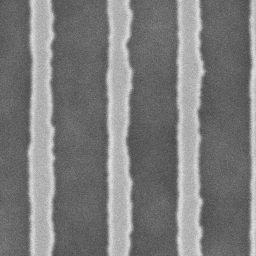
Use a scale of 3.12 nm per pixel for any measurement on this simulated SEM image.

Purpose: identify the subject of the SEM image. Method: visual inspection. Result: lines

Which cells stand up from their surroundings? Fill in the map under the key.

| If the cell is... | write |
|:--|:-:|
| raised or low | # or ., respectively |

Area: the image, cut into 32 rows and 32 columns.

....##........##......###......#
....##........##......###......#
....###.......##......###......#
....##........##......###......#
....###.......##......###......#
....##........##......###......#
....##........##......###......#
....##........##......###.......
....##........##......###.......
....##.......###......###......#
....##.......###......###......#
....##........##......###......#
....##........##......###......#
....##........##......###......#
....##........##......###......#
....##........##......###......#
....###.......##......###......#
....###.......##......###......#
....##........##......###......#
....###.......##......###......#
....###.......##......###.......
....###.......##......###.......
....###.......##......###......#
....###.......##......###......#
....###.......##......###......#
....##........##......###......#
....##........##......###......#
....##........##......###......#
....###.......##......###......#
....###.......##......###......#
....###.......##......###......#
....##........##......###......#